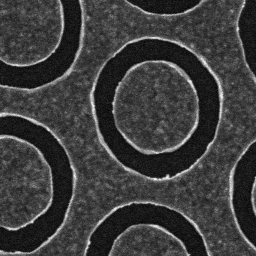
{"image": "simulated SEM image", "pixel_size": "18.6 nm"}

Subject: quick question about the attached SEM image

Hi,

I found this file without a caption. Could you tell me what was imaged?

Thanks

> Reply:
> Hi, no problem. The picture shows ring-shaped grooves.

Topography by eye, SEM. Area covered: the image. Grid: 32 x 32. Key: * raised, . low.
********..******.........******.
********..********.....*******..
********..********************..
********..********************..
********..********************..
*******...******......********..
*******...*****.........*******.
*****....*****...........******.
.........****...******....*****.
........****....*******....*****
......******...*********...*****
************..**********...*****
************..***********...****
************..***********..*****
..**********..***********..*****
.....*******..***********..*****
......******...*********...*****
***....******...*******....*****
****....******...*****....*****.
*****...******...........*****..
******...******.........******..
******...********......******...
*******..********************...
*******..********************...
*******..********************..*
******...*******...**********...
******..******........*******...
****....*****...........******..
.**....*****....****....******..
......*****....*******...******.
.....******...*********...*****.
*.*.*******...*********...******